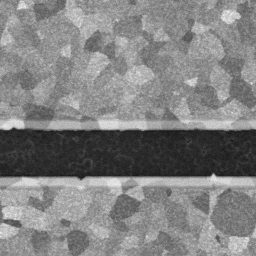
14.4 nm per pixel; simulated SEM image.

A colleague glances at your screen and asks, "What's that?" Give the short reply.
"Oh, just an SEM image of one or a few lines or trenches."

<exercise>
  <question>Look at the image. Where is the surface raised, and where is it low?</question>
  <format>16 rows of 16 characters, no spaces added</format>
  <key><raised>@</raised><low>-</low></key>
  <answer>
@@@@@@@@@@@@@@@@
@@@@@@@@@@@@@@@@
@@@@@@@@@@@@@@@@
@@@@@@@@@@@@@@@@
@@@@@@@@@@@@@@@@
@@@@@@@@@@@@@@@@
@@@@@@@@@@@@@@@@
@@@@@@@@@@@@@@@@
----------------
----------------
----------------
@@@@@@@@@@@@@@@@
@@@@@@@@@@@@@@@@
@@@@@@@@@@@@@@@@
@@@@@@@@@@@@@@@@
@@@@@@@@@@@@@@@@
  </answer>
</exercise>